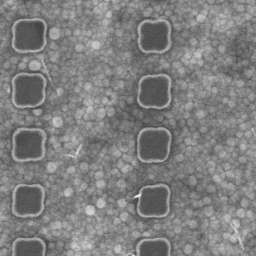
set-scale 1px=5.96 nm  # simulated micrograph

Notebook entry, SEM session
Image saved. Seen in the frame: a regular array of raised bodies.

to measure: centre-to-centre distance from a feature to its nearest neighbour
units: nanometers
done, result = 326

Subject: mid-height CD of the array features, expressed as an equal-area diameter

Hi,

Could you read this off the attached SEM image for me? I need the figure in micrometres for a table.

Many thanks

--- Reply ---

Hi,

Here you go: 0.202